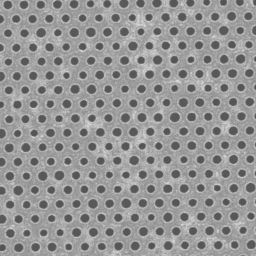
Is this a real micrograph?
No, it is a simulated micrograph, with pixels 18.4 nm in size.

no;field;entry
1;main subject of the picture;a regular array of holes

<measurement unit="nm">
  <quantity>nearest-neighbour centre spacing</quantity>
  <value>298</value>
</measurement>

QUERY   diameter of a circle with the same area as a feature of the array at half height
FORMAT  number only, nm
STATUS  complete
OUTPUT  152